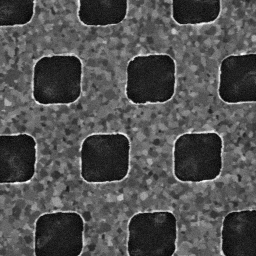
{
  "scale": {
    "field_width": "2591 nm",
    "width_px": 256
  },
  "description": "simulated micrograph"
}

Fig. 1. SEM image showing holes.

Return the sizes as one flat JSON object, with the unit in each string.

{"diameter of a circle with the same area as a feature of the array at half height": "530 nm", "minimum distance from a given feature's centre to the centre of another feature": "0.922 um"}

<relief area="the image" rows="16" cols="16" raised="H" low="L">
LLHHHLLLHHHLLLHH
LHHHHLLHHHHHHHHH
HHHHHHHHHHHHHHHH
HHHHLHHHHLHHHHHL
HHLLLHHHLLLHHHLL
HHLLLHHHLLLHHHLL
HHHLHHHHHHHHHHHH
HHHHHHHHHHHHHHHH
LLHHHHLLHHHLLLHH
LLHHHLLLHHHLLLHH
LLHHHLLLHHHLLLHH
HHHHHHHHHHHHHHHH
HHHHHHHHHHHHHHHH
HHHLLHHHHLLHHHLL
HHLLLHHHLLLHHHLL
HHLLLHHHLLLHHHLL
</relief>